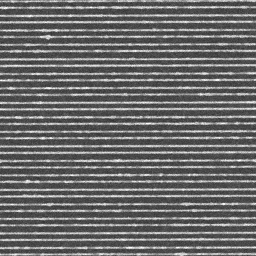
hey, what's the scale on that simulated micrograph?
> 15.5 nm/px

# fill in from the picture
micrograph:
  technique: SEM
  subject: parallel lines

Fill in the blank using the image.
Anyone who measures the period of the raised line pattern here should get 0.112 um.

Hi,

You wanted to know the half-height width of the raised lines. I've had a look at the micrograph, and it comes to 21.3 nm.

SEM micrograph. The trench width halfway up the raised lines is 87.2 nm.